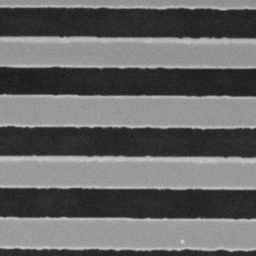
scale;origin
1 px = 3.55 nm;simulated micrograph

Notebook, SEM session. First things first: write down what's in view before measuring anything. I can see lines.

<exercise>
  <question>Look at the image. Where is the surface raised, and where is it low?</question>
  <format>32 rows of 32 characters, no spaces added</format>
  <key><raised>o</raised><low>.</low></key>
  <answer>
oooooooooooooooooooooooooooooooo
................................
................................
................................
................................
oooooooooooooooooooooooooooooooo
oooooooooooooooooooooooooooooooo
oooooooooooooooooooooooooooooooo
...............o.ooooooooooooooo
................................
................................
................................
oooooooooooooooooooooooooooooooo
oooooooooooooooooooooooooooooooo
oooooooooooooooooooooooooooooooo
oooooooooooooooooooooooooooooooo
................................
................................
................................
................................
oooooooooooooooooooooooooooooooo
oooooooooooooooooooooooooooooooo
oooooooooooooooooooooooooooooooo
....oo.oo..ooooooooooooooooooooo
................................
................................
................................
oooooooooooooooooooooooooooooooo
oooooooooooooooooooooooooooooooo
oooooooooooooooooooooooooooooooo
oooooooooooooooooooooooooooooooo
................................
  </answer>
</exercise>